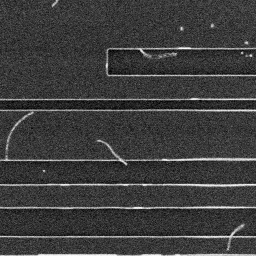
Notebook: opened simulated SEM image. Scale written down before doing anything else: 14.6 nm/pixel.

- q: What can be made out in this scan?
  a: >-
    groups of lines, slits or small figures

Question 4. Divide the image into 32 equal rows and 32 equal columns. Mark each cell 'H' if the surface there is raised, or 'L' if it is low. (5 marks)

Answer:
HHHHHHHHHHHHHHHHHHHHHHHHHHHHHHHH
HHHHHHHHHHHHHHHHHHHHHHHHHHHHHHHH
HHHHHHHHHHHHHHHHHHHHHHHHHHHHHHHH
HHHHHHHHHHHHHHHHHHHHHHHHHHHHHHHH
HHHHHHHHHHHHHHHHHHHHHHHHHHHHHHHH
HHHHHHHHHHHHHHHHHHHHHHHHHHHHHHHH
HHHHHHHHHHHHHLLLLLLLLLLLLLLLLLLL
HHHHHHHHHHHHHLLLLLLLLLLLLLLLLLLL
HHHHHHHHHHHHHLLLLLLLLLLLLLLLLLLL
HHHHHHHHHHHHHHLLLLLLLLLLLLLLLLLL
HHHHHHHHHHHHHHHHHHHHHHHHHHHHHHHH
HHHHHHHHHHHHHHHHHHHHHHHHHHHHHHHH
LLLLLLLLLLLLLLLLLLLLLLLLLLLLLLLL
LLLLLLLLLLLLLLLLLLLLLLLLLLLLLLLL
HHHHHHHHHHHHHHHHHHHHHHHHHHHHHHHH
HHHHHHHHHHHHHHHHHHHHHHHHHHHHHHHH
HHHHHHHHHHHHHHHHHHHHHHHHHHHHHHHH
HHHHHHHHHHHHHHHHHHHHHHHHHHHHHHHH
HHHHHHHHHHHHHHHHHHHHHHHHHHHHHHHH
HHHHHHHHHHHHHHHHHHHHHHHHHHHHHHHH
LLLLLLLLLLLLLLLLLLLLLLLLLLLLLLLL
LLLLLLLLLLLLLLLLLLLLLLLLLLLLLLLL
LLLLLLLLLLLLLLLLLLLLLLLLLLLLLLLL
HHHHHHHHHHHHHHHHHHHHHHHHHHHHHHHH
HHHHHHHHHHHHHHHHHHHHHHHHHHHHHHHH
HHHHHHHHHHHHHHHHHHHHHHHHHHHHHHHH
LLLLLLLLLLLLLLLLLLLLLLLLLLLLLLLL
LLLLLLLLLLLLLLLLLLLLLLLLLLLLLLLL
LLLLLLLLLLLLLLLLLLLLLLLLLLLLLLLL
LLLLLLLLLLLLLLLLLLLLLLLLLLLLHLLL
HHHHHHHHHHHHHHHHHHHHHHHHHHHHHHHH
HHHHHHHHHHHHHHHHHHHHHHHHHHHHHHHH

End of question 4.